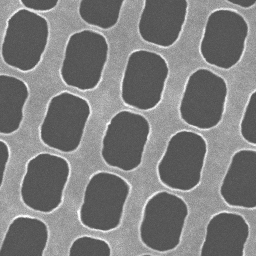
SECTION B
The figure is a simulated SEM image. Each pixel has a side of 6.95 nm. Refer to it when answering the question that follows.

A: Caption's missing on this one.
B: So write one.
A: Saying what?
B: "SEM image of a regular array of holes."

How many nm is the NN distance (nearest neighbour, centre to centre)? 435